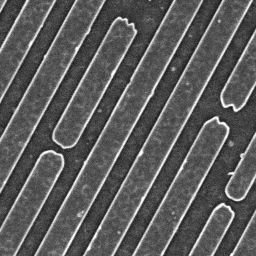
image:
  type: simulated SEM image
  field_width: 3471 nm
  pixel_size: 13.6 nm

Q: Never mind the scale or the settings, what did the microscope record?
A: parallel lines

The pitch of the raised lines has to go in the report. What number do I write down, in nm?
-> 590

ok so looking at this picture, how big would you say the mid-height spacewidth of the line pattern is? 237 nm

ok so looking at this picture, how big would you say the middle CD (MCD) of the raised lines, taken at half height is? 342 nm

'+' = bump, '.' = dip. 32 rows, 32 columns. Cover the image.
+..++++..++++........++++...+++.
...+++...+++.........+++...++++.
..++++..++++..++....++++..++++..
.++++...+++...+++...+++...++++..
.+++...++++..++++..++++..++++...
++++..++++...+++...+++...++++..+
+++...++++..++++..++++..++++..++
+++..++++...+++...+++...+++...++
++...++++..++++..++++..++++..+++
++..++++...+++...+++...+++...+++
+...+++...++++..++++..++++..++++
+..++++..++++..++++...+++...+++.
...+++...++++..+++...++++...+++.
..++++..++++..++++..++++.....+..
..+++...+++...+++...++++........
.++++..++++..++++..++++...++....
.+++...+++...+++...++++..++++...
++++...+++..++++..++++...+++....
+++.........+++...+++...++++...+
+++..+++...++++..++++..++++...++
++...+++...+++...+++...++++...++
+...++++..++++..++++..++++...+++
+..++++..++++...+++...+++....+++
...+++...+++...++++..++++...+++.
..++++..++++..++++...+++.....++.
..+++...+++...++++..++++........
.++++..++++..++++...+++....++...
.+++...+++...++++..++++...+++..+
++++..++++..++++...+++....++...+
+++...+++...+++...++++...+++..++
+++..++++..++++..++++...+++...++
++...+++...+++...++++...+++..+++